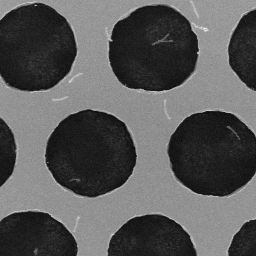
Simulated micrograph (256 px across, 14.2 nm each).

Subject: holes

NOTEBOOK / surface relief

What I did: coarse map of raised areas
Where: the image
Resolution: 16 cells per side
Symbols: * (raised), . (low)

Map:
*..******..*****
....***.....***.
.....**.....**..
.....**.....**..
....***.....***.
*..*****...*****
****************
****...*****...*
.**.....***.....
.**.....**......
.**.....***.....
****....***....*
****************
...******.******
....***.....***.
.....**.....**..